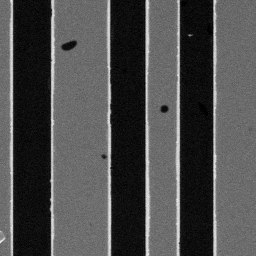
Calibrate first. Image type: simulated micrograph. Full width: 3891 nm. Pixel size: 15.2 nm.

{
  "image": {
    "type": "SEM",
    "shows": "lines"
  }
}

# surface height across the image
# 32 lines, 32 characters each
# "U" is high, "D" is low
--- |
UUDDDDDUUUUUUUDDDDUUUUDDDDDUUUUU
UUDDDDDUUUUUUUDDDDUUUUDDDDDUUUUU
UUDDDDDUUUUUUUDDDDUUUUDDDDDUUUUU
UDDDDDDUUUUUUUDDDDUUUUDDDDDUUUUU
UDDDDDDUUUUUUUDDDDUUUUDDDDDUUUUU
UDDDDDDUUUUUUUDDDDUUUUDDDDDUUUUU
UUDDDDDUUUUUUUDDDDUUUUDDDDDUUUUU
UUDDDDDUUUUUUUDDDDUUUUDDDDDUUUUU
UDDDDDDUUUUUUUDDDDUUUUDDDDDUUUUU
UUDDDDDUUUUUUUDDDDUUUUDDDDDUUUUU
UUDDDDDUUUUUUUDDDDUUUUDDDDDUUUUU
UUDDDDUUUUUUUUDDDDUUUUDDDDDUUUUU
UUDDDDUUUUUUUUDDDDUUUUDDDDDUUUUU
UUDDDDUUUUUUUUDDDDUUUUDDDDDUUUUU
UUDDDDDUUUUUUUDDDDUUUUDDDDDUUUUU
UUDDDDDUUUUUUUDDDDUUUUDDDDDUUUUU
UUDDDDUUUUUUUUDDDDUUUUDDDDDUUUUU
UUDDDDUUUUUUUUDDDDUUUUDDDDDUUUUU
UDDDDDUUUUUUUUDDDDUUUUDDDDDUUUUU
UDDDDDUUUUUUUUDDDDUUUUDDDDDUUUUU
UDDDDDUUUUUUUUDDDDUUUUDDDDDUUUUU
UUDDDDUUUUUUUUDDDDUUUUDDDDDUUUUU
UUDDDDUUUUUUUUDDDDUUUUDDDDDUUUUU
UUDDDDUUUUUUUUDDDDUUUUDDDDDUUUUU
UUDDDDUUUUUUUUDDDDUUUUDDDDDUUUUU
UUDDDDUUUUUUUUDDDDUUUUDDDDDUUUUU
UUDDDDUUUUUUUUDDDDUUUUDDDDDUUUUU
UDDDDDDUUUUUUUDDDDUUUUDDDDDUUUUU
UUDDDDDUUUUUUUDDDDUUUUDDDDDUUUUU
UUDDDDDUUUUUUUDDDDUUUUDDDDDUUUUU
UUDDDDUUUUUUUUDDDDUUUUDDDDDUUUUU
UUDDDDUUUUUUUUDDDDUUUUDDDDDUUUUU